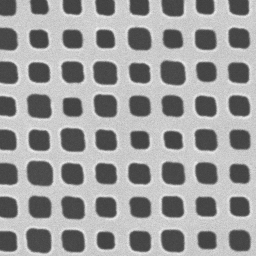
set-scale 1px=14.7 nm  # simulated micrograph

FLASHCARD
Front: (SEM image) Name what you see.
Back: a regular array of holes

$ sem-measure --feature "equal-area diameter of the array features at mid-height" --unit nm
341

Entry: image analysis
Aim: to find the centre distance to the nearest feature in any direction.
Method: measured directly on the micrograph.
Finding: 483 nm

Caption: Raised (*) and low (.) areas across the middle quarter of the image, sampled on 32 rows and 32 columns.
.....**......***.....***......**
.....**......***......**......**
.....**......***......**......**
.....**......***......**......**
....****.....****....****.....**
****************************.***
********************************
********....********************
....***......***.....****....***
....***......***......**......**
.....**......***......**......**
.....**......***......**......**
.....***.....****.....***.....**
**********..********************
********************************
********************************
....****....********************
.....***.....****....****.....**
.....***.....****....****.....**
.....***.....****....****.....**
......**.....****....****.....**
.....****....***************.***
********************************
********************************
*************************...****
....****.....***.....***......**
.....***.....***.....***......**
.....***.....***......**......**
.....***.....***......**.......*
.....***.....****.....***.....**
********************************
********************************